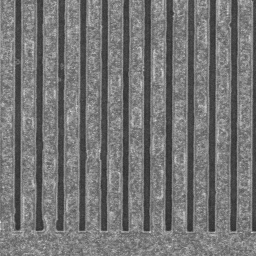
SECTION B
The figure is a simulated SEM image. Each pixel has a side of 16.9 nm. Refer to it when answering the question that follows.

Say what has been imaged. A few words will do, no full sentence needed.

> parallel lines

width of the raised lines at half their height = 252 nm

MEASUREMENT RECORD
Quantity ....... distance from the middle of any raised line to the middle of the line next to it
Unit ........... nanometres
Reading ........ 366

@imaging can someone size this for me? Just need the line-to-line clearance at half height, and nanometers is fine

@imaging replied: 119